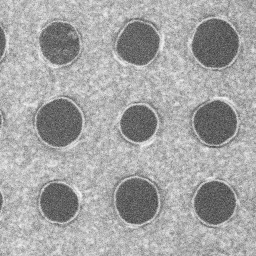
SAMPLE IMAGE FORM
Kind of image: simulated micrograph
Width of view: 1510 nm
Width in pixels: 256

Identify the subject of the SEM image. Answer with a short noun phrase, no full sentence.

a regular array of raised bodies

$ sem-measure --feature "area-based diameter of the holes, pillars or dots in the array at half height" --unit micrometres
0.266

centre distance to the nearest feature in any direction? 0.459 microns